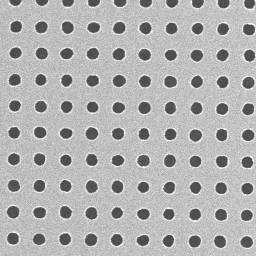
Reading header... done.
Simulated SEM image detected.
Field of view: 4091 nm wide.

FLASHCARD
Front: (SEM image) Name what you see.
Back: a regular array of holes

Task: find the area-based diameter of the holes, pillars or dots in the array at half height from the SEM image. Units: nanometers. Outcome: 196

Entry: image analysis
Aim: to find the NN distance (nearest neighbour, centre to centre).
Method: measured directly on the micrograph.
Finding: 411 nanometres